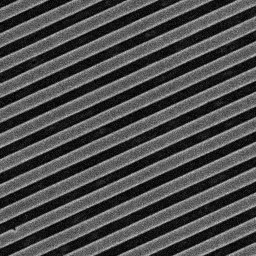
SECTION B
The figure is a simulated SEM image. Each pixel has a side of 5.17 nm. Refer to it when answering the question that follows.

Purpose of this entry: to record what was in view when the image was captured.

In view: parallel lines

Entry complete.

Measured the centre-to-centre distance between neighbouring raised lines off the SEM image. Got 118 nm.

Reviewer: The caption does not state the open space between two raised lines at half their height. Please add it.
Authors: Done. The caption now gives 0.0564 micrometres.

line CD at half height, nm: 61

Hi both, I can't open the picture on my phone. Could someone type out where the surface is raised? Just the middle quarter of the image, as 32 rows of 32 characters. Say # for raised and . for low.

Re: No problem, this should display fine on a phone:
#......########......#######....
.....########......#######......
...#######.......#######......##
.#######......########......####
######......########......######
####......########......#######.
##......#######.......#######...
......#######......########.....
....#######......########......#
.########......#######.......###
#######......#######.......#####
####.......#######.......#######
##.......#######.......######...
.......#######......#######.....
.....#######......#######.......
...######.......#######.......##
#######.......#######.......####
#####.......#######......#######
###.......#######......#######..
#......########......#######....
.....########......#######......
...#######......########......##
.#######......########......####
######......########......######
###.......########......#######.
#.......#######.......#######...
......#######......########.....
....#######......#######.......#
.########......#######.......###
#######......#######......######
####.......#######......########
##......########......#######...